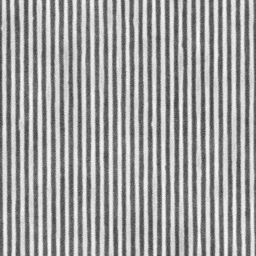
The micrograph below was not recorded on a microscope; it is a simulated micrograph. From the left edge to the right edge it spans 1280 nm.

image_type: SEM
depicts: parallel lines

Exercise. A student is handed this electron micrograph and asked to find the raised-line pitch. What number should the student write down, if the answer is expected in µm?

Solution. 0.0441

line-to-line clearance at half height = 29.4 nm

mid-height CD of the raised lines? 15 nanometers